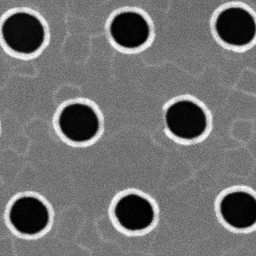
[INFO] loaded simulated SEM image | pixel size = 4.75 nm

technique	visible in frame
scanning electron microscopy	holes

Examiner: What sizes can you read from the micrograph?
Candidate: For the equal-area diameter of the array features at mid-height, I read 38.5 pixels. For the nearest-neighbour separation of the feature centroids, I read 0.501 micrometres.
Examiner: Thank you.